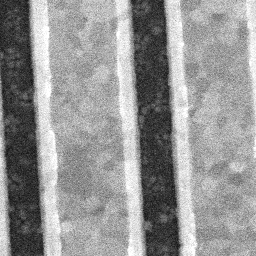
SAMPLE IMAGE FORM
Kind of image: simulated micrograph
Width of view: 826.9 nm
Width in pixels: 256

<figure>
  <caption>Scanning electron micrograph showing one or a few lines or trenches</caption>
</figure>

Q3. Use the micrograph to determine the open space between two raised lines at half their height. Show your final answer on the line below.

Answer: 167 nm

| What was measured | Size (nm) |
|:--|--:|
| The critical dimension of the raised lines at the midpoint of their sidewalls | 271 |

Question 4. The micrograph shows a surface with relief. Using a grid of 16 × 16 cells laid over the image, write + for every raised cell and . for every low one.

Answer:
..++++++...+++++
..++++++...+++++
..++++++...+++++
...+++++...+++++
...+++++...+++++
...+++++...+++++
...+++++...+++++
...+++++...+++++
...+++++...+++++
...+++++...+++++
...+++++...+++++
...+++++....++++
...+++++....++++
...+++++....++++
...+++++....++++
...++++++...++++